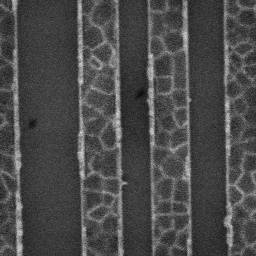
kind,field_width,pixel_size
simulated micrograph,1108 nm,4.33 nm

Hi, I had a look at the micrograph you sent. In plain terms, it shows one or a few lines or trenches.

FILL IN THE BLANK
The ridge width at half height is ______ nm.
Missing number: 169